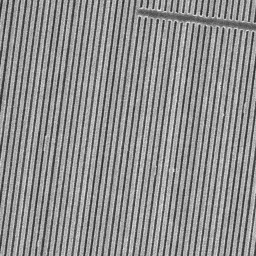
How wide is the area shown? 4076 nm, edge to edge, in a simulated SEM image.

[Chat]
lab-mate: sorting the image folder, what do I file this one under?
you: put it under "parallel lines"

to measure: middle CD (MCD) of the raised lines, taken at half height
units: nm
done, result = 55.3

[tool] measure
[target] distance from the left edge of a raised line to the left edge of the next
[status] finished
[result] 6.04 pixels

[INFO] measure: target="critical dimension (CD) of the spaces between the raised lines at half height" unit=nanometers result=41.4